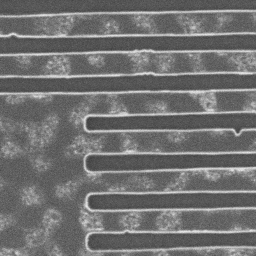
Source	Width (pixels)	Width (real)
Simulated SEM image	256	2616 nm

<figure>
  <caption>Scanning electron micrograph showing parallel lines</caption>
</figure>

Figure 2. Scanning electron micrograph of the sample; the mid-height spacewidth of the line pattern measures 169 nanometers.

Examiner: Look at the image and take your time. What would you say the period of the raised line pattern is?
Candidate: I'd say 404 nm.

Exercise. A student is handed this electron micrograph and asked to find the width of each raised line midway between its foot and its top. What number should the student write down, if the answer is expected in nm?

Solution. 231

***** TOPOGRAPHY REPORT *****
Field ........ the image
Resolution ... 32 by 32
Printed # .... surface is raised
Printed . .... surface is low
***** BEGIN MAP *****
................................
........................########
################################
################################
#.##########....................
................................
..............######.###########
################################
################################
##########......................
................................
......................##########
################################
################################
###########.....................
###########.....................
#############################.##
################################
################################
###########.....................
###########.....................
############....################
################################
################################
###########.....................
###########.....................
################################
################################
################################
###########.....................
###########.....................
################################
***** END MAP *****